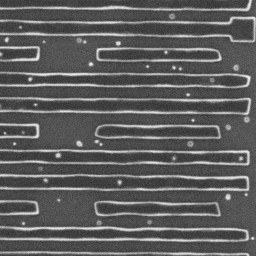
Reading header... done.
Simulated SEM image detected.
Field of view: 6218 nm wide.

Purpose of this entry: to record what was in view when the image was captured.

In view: wiring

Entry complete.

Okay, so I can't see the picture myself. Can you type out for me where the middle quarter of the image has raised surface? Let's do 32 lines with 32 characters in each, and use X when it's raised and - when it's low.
--------------------------------
--------------------------------
-------------XXXX---------------
XXXXXXXXXXXXXXXXXXXXXXXXXXXXXXXX
XXXXXXXXXXXXXXXXXXXXXXXXXXXXXXXX
--------XXXXXXXXXXXX-XX---XXXXXX
--------------------------------
--------------------------------
--------------------------------
XXXXXXXXXXXXXXXXXXXXXXXXXXXXXXXX
XXXXXXXXXXXXXXXXXXXXXXXXXXXXXXXX
XXXXXXXXXXXXXXXXXXXXXXXXXXXXXXXX
--------------------------------
--------------------------------
--------------------------------
---------XXXXXX------------XXX--
--------XXXXXXXXXXXXXXXXXXXXXXXX
--------XXXXXXXXXXXXXXXXXXXXXXXX
--------------------------------
--------------------------------
--------------------------------
--------------------------------
XXXXXXXXXXXXXXXXXXXXXXXXXXXXXXXX
XXXXXXXXXXXXXXXXXXXXXXXXXXXXXXXX
XXXXXXXXXXXXXXXXXXXXXXXXXXXXXXXX
--------------------------------
--------------------------------
--------------------------------
XXXXXXXXXXXXXXXXXXXXXXXXXXXXXXXX
XXXXXXXXXXXXXXXXXXXXXXXXXXXXXXXX
XXXXXXXXXXXXXXXXXXXXXXXXXXXXXXXX
--------------------------------